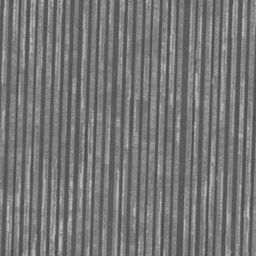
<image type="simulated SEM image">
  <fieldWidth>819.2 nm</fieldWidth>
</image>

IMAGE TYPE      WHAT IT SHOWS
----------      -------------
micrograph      parallel lines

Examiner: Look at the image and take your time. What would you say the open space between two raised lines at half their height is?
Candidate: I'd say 13.2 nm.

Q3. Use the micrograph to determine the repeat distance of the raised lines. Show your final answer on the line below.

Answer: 28.1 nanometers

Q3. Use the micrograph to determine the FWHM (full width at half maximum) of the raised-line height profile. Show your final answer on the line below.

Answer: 16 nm